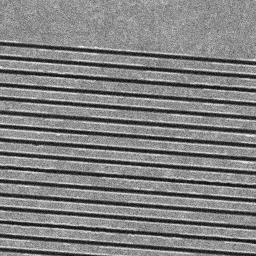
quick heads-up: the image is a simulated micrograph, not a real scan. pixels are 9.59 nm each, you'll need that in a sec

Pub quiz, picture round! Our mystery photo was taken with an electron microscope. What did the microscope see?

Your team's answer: parallel lines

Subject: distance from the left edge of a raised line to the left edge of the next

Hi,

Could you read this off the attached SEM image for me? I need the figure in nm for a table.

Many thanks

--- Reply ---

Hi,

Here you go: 131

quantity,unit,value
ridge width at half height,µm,0.092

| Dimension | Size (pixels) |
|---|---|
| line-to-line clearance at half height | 3.86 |